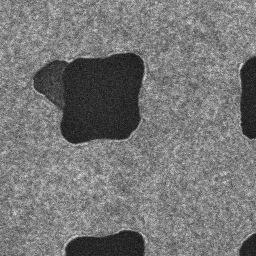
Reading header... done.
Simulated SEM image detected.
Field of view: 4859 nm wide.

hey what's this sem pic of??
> holes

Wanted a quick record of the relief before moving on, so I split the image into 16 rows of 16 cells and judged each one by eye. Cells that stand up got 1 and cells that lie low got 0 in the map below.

1111111111111111
1111111111111111
1111111111111111
1111111001111111
1100000001111110
1100000001111110
1110000001111110
1111000001111110
1111000011111110
1111111111111111
1111111111111111
1111111111111111
1111111111111111
1111111111111111
1111111011111111
1111000001111110